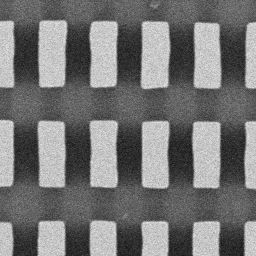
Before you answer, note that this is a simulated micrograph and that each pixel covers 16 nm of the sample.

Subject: groups of lines, slits or small figures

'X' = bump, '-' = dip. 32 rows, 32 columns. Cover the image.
--------------------------------
--------------------------------
--------------------------------
XX---XXX---XXXX---XXX---XXX----X
XX---XXX---XXXX---XXX---XXX----X
XX---XXX---XXX----XXX---XXX----X
XX---XXX---XXX----XXX---XXXX---X
XX---XXX----XX----XXX---XXXX---X
XX---XXX---XXX----XXX---XXXX---X
XX---XXX---XXX----XXX---XXXX---X
XX---XXX---XXX----XXX---XXXX---X
--------------------------------
--------------------------------
--------------------------------
--------------------------------
XX---XXX---XXXX---XXX---XXX----X
XX---XXX---XXXX---XXX---XXX----X
XX---XXX---XXX----XXX---XXX----X
XX---XXX----XX----XXX---XXX----X
XX---XXX---XXX----XXX---XXX----X
XX---XXX---XXX----XXX---XXXX---X
XX---XXX---XXXX---XXX---XXX----X
XX---XXX---XXXX---XXX---XXX----X
-------------------------------X
--------------------------------
--------------------------------
--------------------------------
--------------------------------
X----XXX---XXX----XXX---XXX----X
XX---XXX---XXX----XXX---XXX----X
XX---XXX---XXX----XXX---XXX----X
X----XXX---XXX----XXX---XXX----X